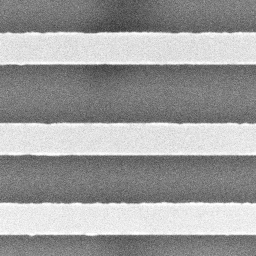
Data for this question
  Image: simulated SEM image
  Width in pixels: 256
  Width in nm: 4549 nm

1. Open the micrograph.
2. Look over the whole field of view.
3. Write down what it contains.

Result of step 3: lines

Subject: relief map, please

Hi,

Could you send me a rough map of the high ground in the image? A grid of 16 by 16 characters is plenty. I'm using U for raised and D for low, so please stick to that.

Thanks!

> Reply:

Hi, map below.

DDDDDDDDDDDDDDDD
DDDDDDDDDDDDDDDD
UUUUUUUUUUUUUUUU
UUUUUUUUUUUUUUUU
DDDDDDDDDDDDDDDD
DDDDDDDDDDDDDDDD
DDDDDDDDDDDDDDDD
DDDDDDDDDDDDDDDD
UUUUUUUUUUUUUUUU
UUUUUUUUUUUUUUUU
DDDDDDDDDDDDDDDD
DDDDDDDDDDDDDDDD
DDDDDDDDDDDDDDDD
UUUUUUUUUUUUUUUU
UUUUUUUUUUUUUUUU
DDDDDDDDDDDDDDDD